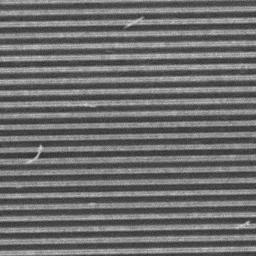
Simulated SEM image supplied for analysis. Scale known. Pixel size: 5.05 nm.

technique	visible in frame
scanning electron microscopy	parallel lines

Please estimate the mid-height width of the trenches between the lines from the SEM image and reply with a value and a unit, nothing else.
35.3 nm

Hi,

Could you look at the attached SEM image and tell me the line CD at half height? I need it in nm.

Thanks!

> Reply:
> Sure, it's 22.7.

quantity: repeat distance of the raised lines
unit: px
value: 11.4